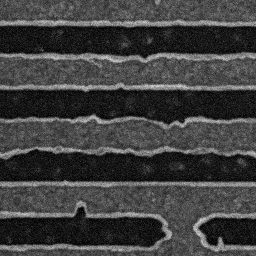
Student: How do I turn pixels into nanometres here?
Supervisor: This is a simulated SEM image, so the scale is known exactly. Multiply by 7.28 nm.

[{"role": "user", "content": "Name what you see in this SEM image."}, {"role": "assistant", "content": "one or a few lines or trenches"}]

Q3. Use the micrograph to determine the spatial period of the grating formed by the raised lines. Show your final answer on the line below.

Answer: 464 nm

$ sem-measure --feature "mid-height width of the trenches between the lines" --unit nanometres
226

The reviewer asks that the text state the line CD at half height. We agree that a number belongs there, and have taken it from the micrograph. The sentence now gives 240 nm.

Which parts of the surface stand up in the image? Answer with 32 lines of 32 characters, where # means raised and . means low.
################################
################################
################################
................................
................................
................................
................................
################################
################################
################################
################################
................................
................................
................................
................................
####################...#########
################################
################################
################################
#...............................
................................
................................
................................
################################
################################
################################
#########..#####################
....................######......
.....................####.......
.....................####.......
....................######.#....
################################